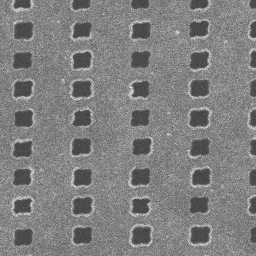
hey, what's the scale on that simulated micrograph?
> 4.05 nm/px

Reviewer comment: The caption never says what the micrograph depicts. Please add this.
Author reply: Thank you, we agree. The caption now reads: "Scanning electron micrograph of a regular array of holes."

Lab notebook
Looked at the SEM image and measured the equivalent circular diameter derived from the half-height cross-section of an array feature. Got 0.0718 microns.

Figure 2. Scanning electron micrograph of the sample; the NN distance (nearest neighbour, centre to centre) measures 117 nm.